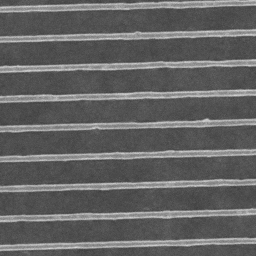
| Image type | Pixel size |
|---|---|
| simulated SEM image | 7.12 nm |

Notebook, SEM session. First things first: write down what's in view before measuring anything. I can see parallel lines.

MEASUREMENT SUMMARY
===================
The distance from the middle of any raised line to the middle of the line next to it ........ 212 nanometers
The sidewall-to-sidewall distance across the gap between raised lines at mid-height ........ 174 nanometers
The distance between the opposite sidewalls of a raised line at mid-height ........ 34.7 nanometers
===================